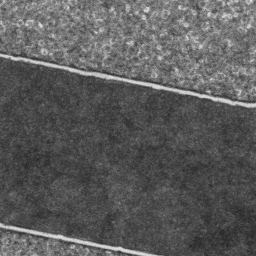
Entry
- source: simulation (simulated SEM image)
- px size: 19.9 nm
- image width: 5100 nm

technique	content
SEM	one or a few lines or trenches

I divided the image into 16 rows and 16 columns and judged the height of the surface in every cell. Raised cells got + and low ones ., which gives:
................
................
................
................
+++++...........
++++++++++......
+++++++++++++++.
++++++++++++++++
++++++++++++++++
++++++++++++++++
++++++++++++++++
++++++++++++++++
++++++++++++++++
++++++++++++++++
..++++++++++++++
.......+++++++++